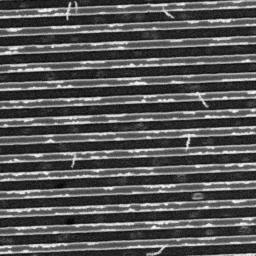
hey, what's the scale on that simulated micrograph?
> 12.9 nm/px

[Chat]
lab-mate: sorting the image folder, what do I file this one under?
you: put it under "parallel lines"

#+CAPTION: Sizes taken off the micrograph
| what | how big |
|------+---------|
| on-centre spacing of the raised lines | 233 nm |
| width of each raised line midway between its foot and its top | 6.87 px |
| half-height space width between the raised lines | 145 nm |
